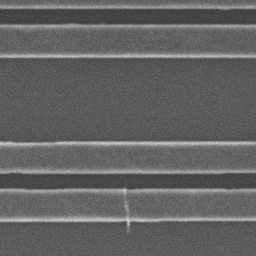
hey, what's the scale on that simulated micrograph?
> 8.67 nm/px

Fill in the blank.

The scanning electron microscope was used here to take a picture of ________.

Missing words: lines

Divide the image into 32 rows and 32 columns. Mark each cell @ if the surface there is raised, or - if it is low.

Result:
@@@@@@@@@@@@@@@@@@@@@@@@@@@@@@@@
--------------------------------
--------------------------------
@@@@@@@@@@@@@@@@@@@@@@@@@@@@@@@@
@@@@@@@@@@@@@@@@@@@@@@@@@@@@@@@@
@@@@@@@@@@@@@@@@@@@@@@@@@@@@@@@@
@@@@@@@@@@@@@@@@@@@@@@@@@@@@@@@@
--------------------------------
--------------------------------
--------------------------------
--------------------------------
--------------------------------
--------------------------------
--------------------------------
--------------------------------
--------------------------------
--------------------------------
--------------------------------
@@@@@@@@@@@@@@@@@@@@@@@@@@@@@@@@
@@@@@@@@@@@@@@@@@@@@@@@@@@@@@@@@
@@@@@@@@@@@@@@@@@@@@@@@@@@@@@@@@
@@@@@@@@@@@@@@@@@@@@@@@@@@@@@@@@
--------------------------------
--------------------------------
@@@@@@@@@@@@@@@@@@@@@@@@@@@@@@@@
@@@@@@@@@@@@@@@@@@@@@@@@@@@@@@@@
@@@@@@@@@@@@@@@@@@@@@@@@@@@@@@@@
@@@@@@@@@@@@@@@@@@@@@@@@@@@@@@@@
--------------------------------
--------------------------------
--------------------------------
--------------------------------